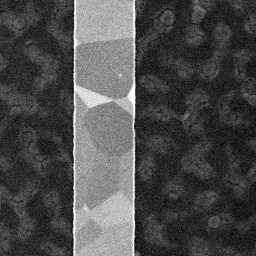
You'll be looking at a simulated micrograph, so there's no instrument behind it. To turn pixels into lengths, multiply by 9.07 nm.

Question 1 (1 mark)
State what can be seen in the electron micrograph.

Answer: one or a few lines or trenches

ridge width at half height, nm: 548